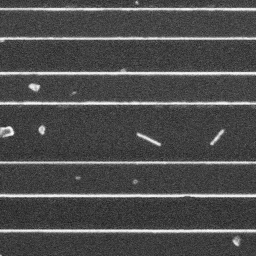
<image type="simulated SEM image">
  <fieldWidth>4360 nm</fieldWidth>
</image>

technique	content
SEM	lines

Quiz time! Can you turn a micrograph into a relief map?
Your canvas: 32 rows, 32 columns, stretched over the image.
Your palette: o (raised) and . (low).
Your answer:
................................
oooooooooooooooooooooooooooooooo
oooooooooooooooooooooooooooooooo
oooooooooooooooooooooooooooooooo
oooooooooooooooooooooooooooooooo
................................
................................
................................
................................
oooooooooooooooooooooooooooooooo
oooooooooooooooooooooooooooooooo
oooooooooooooooooooooooooooooooo
oooooooooooooooooooooooooooooooo
................................
................................
................................
................................
................................
................................
................................
oooooooooooooooooooooooooooooooo
oooooooooooooooooooooooooooooooo
oooooooooooooooooooooooooooooooo
oooooooooooooooooooooooooooooooo
ooooooooooooooooooooooo.oooooooo
................................
................................
................................
................................
oooooooooooooooooooooooooooooooo
oooooooooooooooooooooooooooooooo
oooooooooooooooooooooooooooooooo